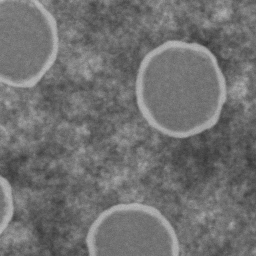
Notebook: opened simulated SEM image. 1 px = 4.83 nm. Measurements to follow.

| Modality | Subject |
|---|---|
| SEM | raised bodies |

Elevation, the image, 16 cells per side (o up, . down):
ooo.............
ooo.............
oooo............
ooo......oooo...
ooo......ooooo..
.........ooooo..
.........ooooo..
.........oooo...
................
................
................
................
o...............
o.....oooo......
......ooooo.....
......ooooo.....